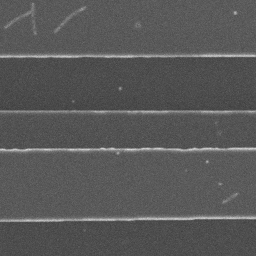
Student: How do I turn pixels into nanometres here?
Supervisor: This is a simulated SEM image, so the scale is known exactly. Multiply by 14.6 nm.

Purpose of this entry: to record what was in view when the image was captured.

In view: lines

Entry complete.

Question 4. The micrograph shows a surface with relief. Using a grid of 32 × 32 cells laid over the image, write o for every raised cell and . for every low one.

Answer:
oooooooooooooooooooooooooooooooo
oooooooooooooooooooooooooooooooo
oooooooooooooooooooooooooooooooo
oooooooooooooooooooooooooooooooo
oooooooooooooooooooooooooooooooo
oooooooooooooooooooooooooooooooo
oooooooooooooooooooooooooooooooo
................................
................................
................................
................................
................................
................................
................................
................................
................................
................................
................................
................................
oooooooooooooooooooooooooooooooo
oooooooooooooooooooooooooooooooo
oooooooooooooooooooooooooooooooo
oooooooooooooooooooooooooooooooo
oooooooooooooooooooooooooooooooo
oooooooooooooooooooooooooooooooo
oooooooooooooooooooooooooooooooo
oooooooooooooooooooooooooooooooo
ooooooooooooooo.................
................................
................................
................................
................................